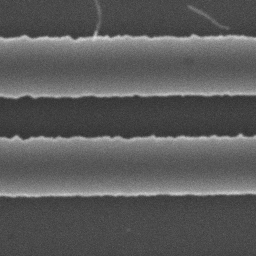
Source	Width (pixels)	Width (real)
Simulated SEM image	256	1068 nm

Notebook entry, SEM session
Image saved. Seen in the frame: lines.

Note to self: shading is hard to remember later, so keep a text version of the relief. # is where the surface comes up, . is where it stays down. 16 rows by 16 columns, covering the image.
................
................
################
################
################
################
................
................
................
################
################
################
................
................
................
................